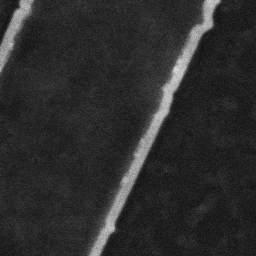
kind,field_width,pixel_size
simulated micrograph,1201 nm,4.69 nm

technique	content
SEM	one or a few lines or trenches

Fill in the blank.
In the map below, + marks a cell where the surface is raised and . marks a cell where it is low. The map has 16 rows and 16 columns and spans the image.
.++++++++++++...
.++++++++++++...
++++++++++++....
++++++++++++....
+++++++++++.....
+++++++++++.....
++++++++++......
++++++++++......
++++++++++......
+++++++++.......
+++++++++.......
++++++++........
++++++++........
+++++++.........
+++++++.........
++++++..........